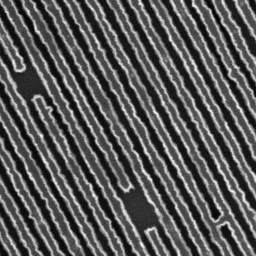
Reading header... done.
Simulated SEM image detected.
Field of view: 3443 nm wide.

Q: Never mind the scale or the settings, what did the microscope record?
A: parallel lines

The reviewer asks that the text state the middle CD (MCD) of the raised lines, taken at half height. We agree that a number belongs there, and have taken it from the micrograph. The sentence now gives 135 nm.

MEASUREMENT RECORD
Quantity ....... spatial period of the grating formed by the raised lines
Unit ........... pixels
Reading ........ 18.7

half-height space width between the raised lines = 110 nm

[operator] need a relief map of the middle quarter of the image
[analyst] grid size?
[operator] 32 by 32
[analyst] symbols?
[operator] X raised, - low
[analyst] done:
X--XXX---XXX--XXX---XX---XX---XX
X---XXX--XXX---XXX--XXX---XX---X
XX---XX---XXX---XX---XX---XXX--X
XXX--XXX--XXX---XXX--XXX---XX---
XXX---XXX--XXX--XXX---XX---XXX--
-XXX--XXX---XXX--XXX---XX---XX--
-XXX--XXX---XXX---XX---XX---XX--
--XXX--XXX---XX---XXX---XX--XXX-
---XX--XXXX---XX---XXX--XX---XXX
X--XXX--XXXX--XX---XXX--XXX---XX
X--XXX---XXX--XXX---XX---XXX--XX
XX--XXX--XXX---XXX--XXX---XX---X
XX---XX---XXX--XXX---XX---XXX--X
XXX--XXX--XXX---XXX--XXX---XX---
XXX---XX----X----XX---XX---XXX--
-XX---XXX---XX---XXX--XXX--XXX--
-XXX---XXX--XXX---XXX--XX---XXX-
--XXX--XXX--XXXX--XXX--XXX---XXX
---XXX--XXX--XXX---XX---XXX--XXX
X--XXX--XXX---XXX--XXX---XX---XX
X---XX---XXX--XXX---XX---XXX--XX
X---XXX--XXX---XX---XXX---XX---X
XX---XXX--XXX---XXX--XX---XXX--X
XX---XXX---XX---XXX--XXX--XXX---
XXX--XXXX--XXX---XX---XXX--XXX--
-XXX--XXX---XX---XXX--XXXX--XX--
--XX---XXX--XXX--XXX---XXX--XXX-
--XXX--XXX---XX---XXX--XXX---XXX
---XX---XXX---XX---XXX--XXX--XXX
---XXX--XXX---XX---XXX---XX---XX
X---XXX--XXX--XXX--XXX---XXX--XX
XX--XXX---XX---X----XXX---XX---X